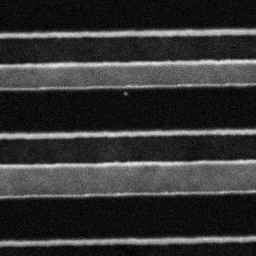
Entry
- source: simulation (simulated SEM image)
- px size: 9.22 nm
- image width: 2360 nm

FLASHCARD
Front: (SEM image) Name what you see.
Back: lines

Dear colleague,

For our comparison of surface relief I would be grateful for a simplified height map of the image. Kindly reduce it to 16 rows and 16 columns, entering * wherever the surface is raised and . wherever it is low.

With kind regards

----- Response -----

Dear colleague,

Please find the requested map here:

****************
****************
................
................
****************
****************
****************
****************
.*..............
................
****************
****************
****************
****************
****************
................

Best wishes